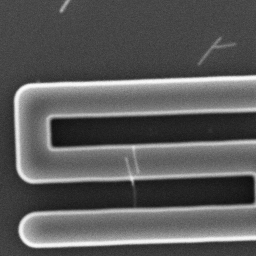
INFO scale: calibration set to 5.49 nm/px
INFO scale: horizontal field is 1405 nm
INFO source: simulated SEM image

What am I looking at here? groups of lines, slits or small figures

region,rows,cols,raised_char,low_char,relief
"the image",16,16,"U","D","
DDDDDDDDDDDDDDDD
DDDDDDDDDDDDDDDD
DDDDDDDDDDDDDDDD
DDDDDDDDDDDDDDDD
DDDDDDDDDDDDDDDD
DDUUUUUUUUUUUUUU
DUUUUUUUUUUUUUUU
DUUDDDDDDDDDDDDD
DUUDDDDDDDDDDDDD
DUUUUUUUUUUUUUUU
DUUUUUUUUUUUUUUU
DDDDDDDDDDDDDDDD
DDDDDDDDDDDDDDDD
DDUUUUUUUUUUUUUU
DUUUUUUUUUUUUUUU
DDDDDDDDDDDDDDDD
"